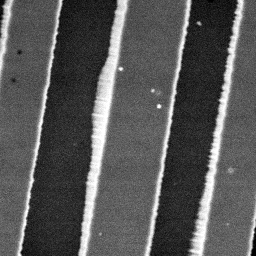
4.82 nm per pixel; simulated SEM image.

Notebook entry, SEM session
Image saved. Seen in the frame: lines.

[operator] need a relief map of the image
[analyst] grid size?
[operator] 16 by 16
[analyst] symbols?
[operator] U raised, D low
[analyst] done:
DUUUDDDDUUUUDDDU
UUUUDDDUUUUUDDDU
UUUDDDDUUUUUDDDU
UUUDDDDUUUUDDDUU
UUUDDDDUUUUDDDUU
UUUDDDDUUUUDDDUU
UUUDDDDUUUUDDDUU
UUUDDDUUUUUDDDUU
UUDDDDUUUUDDDDUU
UUDDDDUUUUDDDUUU
UUDDDDUUUUDDDUUU
UUDDDDUUUUDDDUUU
UUDDDDUUUUDDDUUU
UUDDDUUUUUDDDUUU
UDDDDUUUUDDDDUUU
UDDDDUUUUDDDUUUU